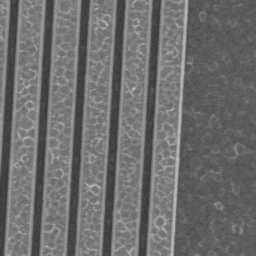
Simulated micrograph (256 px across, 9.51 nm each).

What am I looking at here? parallel lines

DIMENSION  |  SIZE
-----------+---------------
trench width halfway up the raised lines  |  107 nanometers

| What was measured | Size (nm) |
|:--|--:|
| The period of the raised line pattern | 337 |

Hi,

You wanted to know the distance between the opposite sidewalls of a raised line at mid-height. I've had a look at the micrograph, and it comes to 0.229 µm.